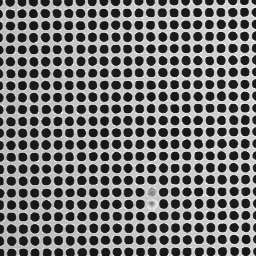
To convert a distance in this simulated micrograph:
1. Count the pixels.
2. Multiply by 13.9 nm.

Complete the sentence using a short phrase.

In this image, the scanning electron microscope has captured a regular array of holes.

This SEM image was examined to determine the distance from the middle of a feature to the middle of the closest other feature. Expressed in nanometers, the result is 158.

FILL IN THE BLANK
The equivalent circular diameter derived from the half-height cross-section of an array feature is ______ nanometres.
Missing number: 131